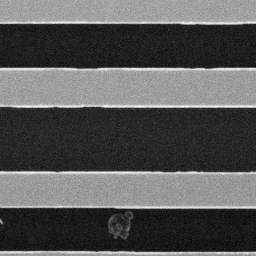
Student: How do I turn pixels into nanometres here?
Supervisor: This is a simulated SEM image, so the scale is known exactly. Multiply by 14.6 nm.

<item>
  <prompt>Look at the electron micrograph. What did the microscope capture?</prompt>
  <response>lines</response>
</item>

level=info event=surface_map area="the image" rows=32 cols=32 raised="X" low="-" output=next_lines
XXXXXXXXXXXXXXXXXXXXXXXXXXXXXXXX
XXXXXXXXXXXXXXXXXXXXXXXXXXXXXXXX
XXXXXXXXXXXXXXXXXXXXXXXXXXXXXXXX
--------------------------------
--------------------------------
--------------------------------
--------------------------------
--------------------------------
--------------------------------
XXXXXXXXXXXXXXXXXXXXXXXXXXXXXXXX
XXXXXXXXXXXXXXXXXXXXXXXXXXXXXXXX
XXXXXXXXXXXXXXXXXXXXXXXXXXXXXXXX
XXXXXXXXXXXXXXXXXXXXXXXXXXXXXXXX
--------------------------------
--------------------------------
--------------------------------
--------------------------------
--------------------------------
--------------------------------
--------------------------------
--------------------------------
--------------------------------
XXXXXXXXXXXXXXXXXXXXXXXXXXXXXXXX
XXXXXXXXXXXXXXXXXXXXXXXXXXXXXXXX
XXXXXXXXXXXXXXXXXXXXXXXXXXXXXXXX
XXXXXXXXXXXXXXXXXXXXXXXXXXXXXXXX
--------------------------------
--------------------------------
--------------------------------
--------------------------------
--------------------------------
XXXXXXXXXXXXXXXX----------------